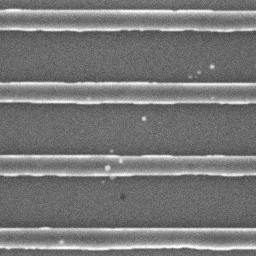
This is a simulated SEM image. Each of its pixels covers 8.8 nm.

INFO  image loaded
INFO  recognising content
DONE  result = lines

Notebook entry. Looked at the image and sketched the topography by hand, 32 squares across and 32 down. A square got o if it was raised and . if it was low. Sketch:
................................
oooooooooooooooooooooooooooooooo
oooooooooooooooooooooooooooooooo
oooooooooooooooooooooooooooooooo
................................
................................
................................
................................
................................
................................
oooooooooooooooooooooooooooooooo
oooooooooooooooooooooooooooooooo
oooooooooooooooooooooooooooooooo
................................
................................
................................
................................
................................
................................
................................
oooooooooooooooooooooooooooooooo
oooooooooooooooooooooooooooooooo
................................
................................
................................
................................
................................
................................
................................
oooooooooooooooooooooooooooooooo
oooooooooooooooooooooooooooooooo
................................